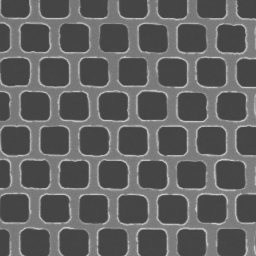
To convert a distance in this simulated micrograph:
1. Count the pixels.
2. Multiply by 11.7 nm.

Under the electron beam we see a regular array of holes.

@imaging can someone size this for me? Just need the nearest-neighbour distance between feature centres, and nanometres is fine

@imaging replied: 455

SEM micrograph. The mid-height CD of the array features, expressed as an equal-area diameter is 0.366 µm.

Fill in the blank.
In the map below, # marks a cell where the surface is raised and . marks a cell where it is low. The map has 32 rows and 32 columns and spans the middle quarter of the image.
.###.......###.......###.......#
.###.......###.......###.......#
.###.......###.......###.......#
.###.......###.......###.......#
.###.......###.......###.......#
#####.....#####.....#####.....##
################################
......###......####......####...
......###.......##........##....
......###.......##........##....
......###.......##........##....
......###.......##........##....
......###.......##........##....
......###.......###......####...
################################
#####...########################
.###.......###.......###......##
.###.......##........##........#
.###.......##........###.......#
.###.......##........###.......#
.###.......##........###.......#
.###.......###.......###.......#
#####.....#####.....####......##
################################
.....####......####......####...
......###.......###.......##....
......##........##........##....
......##........##........##....
......###.......##........##....
......###.......##........##....
......###.......###.......###...
################################